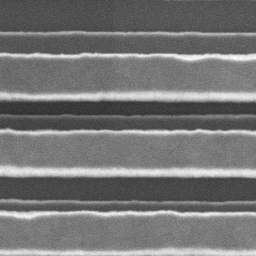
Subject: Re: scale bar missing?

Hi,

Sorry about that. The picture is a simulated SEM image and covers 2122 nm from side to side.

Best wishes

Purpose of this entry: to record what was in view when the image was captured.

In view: lines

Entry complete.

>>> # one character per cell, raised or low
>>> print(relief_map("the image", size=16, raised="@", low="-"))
----------------
----------------
----------------
@@@@@@@@@@@--@--
@@@@@@@@@@@@@@@@
@@@@@@@@@@@@@@@@
----------------
----------------
@@@@@@@@@@@@@@@@
@@@@@@@@@@@@@@@@
@@@@@@@@@@@@@@@@
----------------
----------------
@@@@@@@@@@@@@@@@
@@@@@@@@@@@@@@@@
@@@@@@@@@@@@@@@@